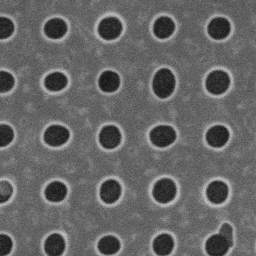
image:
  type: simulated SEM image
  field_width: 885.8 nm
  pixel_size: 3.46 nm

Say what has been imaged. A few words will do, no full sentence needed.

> a regular array of holes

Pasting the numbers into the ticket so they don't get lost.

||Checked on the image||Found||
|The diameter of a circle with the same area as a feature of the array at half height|84.1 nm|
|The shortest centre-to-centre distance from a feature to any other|185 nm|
